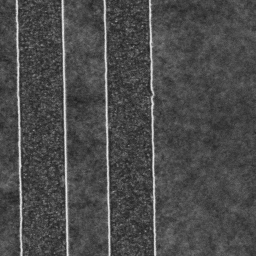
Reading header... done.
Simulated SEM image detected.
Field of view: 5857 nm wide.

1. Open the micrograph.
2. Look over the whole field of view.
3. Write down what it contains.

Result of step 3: one or a few lines or trenches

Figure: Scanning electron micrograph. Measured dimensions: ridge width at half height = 1050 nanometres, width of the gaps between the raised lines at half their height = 42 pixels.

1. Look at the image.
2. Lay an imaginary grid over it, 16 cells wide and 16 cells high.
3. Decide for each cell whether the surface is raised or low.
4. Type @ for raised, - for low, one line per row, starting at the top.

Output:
-@@@---@@-------
-@@@---@@-------
-@@@---@@-------
-@@@---@@-------
-@@@---@@-------
-@@@---@@-------
-@@@---@@-------
-@@@---@@@------
-@@@---@@@------
-@@@---@@@------
-@@@---@@@------
-@@@---@@@------
-@@@---@@@------
-@@@---@@@------
-@@@---@@@------
-@@@---@@@------